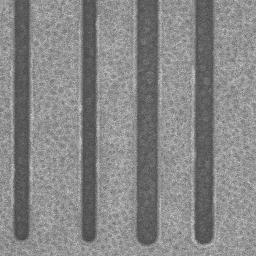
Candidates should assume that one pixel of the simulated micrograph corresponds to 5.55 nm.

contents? one or a few lines or trenches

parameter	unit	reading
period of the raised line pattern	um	0.336